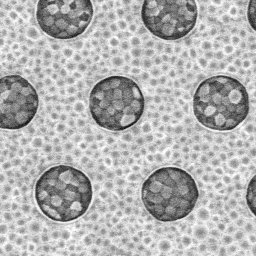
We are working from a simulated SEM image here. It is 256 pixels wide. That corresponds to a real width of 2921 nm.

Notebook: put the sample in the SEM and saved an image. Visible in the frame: holes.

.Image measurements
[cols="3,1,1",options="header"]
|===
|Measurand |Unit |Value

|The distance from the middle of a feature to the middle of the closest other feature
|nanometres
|1190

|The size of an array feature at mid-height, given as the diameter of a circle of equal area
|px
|56.5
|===